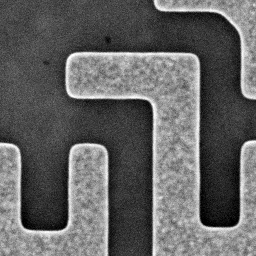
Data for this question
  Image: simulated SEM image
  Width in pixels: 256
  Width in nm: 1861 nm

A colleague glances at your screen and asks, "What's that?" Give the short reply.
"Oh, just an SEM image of wiring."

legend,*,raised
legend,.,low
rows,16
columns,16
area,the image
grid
..........******
...............*
...............*
.....*******...*
....********...*
....********...*
.........***....
..........**....
..........**....
*...***...**...*
*...***...**...*
*...***...**...*
*...***...**...*
*...***...**...*
*******...******
*******...******